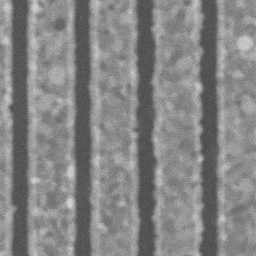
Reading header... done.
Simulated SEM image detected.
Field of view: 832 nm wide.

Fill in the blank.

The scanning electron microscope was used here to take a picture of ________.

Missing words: one or a few lines or trenches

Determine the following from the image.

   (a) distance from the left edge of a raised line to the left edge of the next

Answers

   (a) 204 nanometres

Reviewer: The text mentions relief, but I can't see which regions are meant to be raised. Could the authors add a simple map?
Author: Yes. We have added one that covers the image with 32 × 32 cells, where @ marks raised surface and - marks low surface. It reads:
@---@@@@@---@@@@@---@@@@@---@@@@
@---@@@@@---@@@@@--@@@@@@---@@@@
@---@@@@@---@@@@@---@@@@@---@@@@
@---@@@@@---@@@@@--@@@@@@---@@@@
@---@@@@@---@@@@@---@@@@----@@@@
@---@@@@@---@@@@@---@@@@@---@@@@
@---@@@@@---@@@@@---@@@@@--@@@@@
@---@@@@@---@@@@@---@@@@@--@@@@@
@---@@@@@---@@@@@---@@@@@--@@@@@
@---@@@@@---@@@@@--@@@@@@--@@@@@
@---@@@@@---@@@@@--@@@@@@--@@@@@
@---@@@@@---@@@@@--@@@@@@---@@@@
@---@@@@@---@@@@@---@@@@@--@@@@@
@---@@@@@---@@@@@---@@@@@---@@@@
@---@@@@@---@@@@@---@@@@@---@@@@
@---@@@@@---@@@@@---@@@@@---@@@@
@---@@@@@---@@@@@--@@@@@@---@@@@
@---@@@@@---@@@@@--@@@@@@---@@@@
@---@@@@@---@@@@@---@@@@@---@@@@
@---@@@@@---@@@@@---@@@@@---@@@@
@---@@@@@---@@@@@---@@@@@---@@@@
@---@@@@@---@@@@@---@@@@@--@@@@@
@---@@@@@---@@@@@---@@@@@---@@@@
@---@@@@@---@@@@@---@@@@@---@@@@
@---@@@@@---@@@@@---@@@@@---@@@@
@---@@@@@---@@@@@---@@@@@---@@@@
@---@@@@@---@@@@@--@@@@@@---@@@@
@---@@@@@---@@@@@--@@@@@@---@@@@
@---@@@@@---@@@@@---@@@@@---@@@@
@---@@@@@---@@@@@---@@@@@---@@@@
@---@@@@@---@@@@@---@@@@@---@@@@
@---@@@@@---@@@@@---@@@@@---@@@@